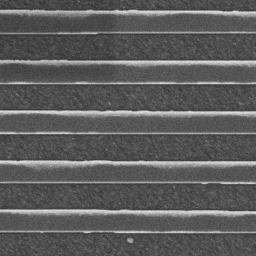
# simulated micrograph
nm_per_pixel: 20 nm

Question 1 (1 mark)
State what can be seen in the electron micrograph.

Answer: lines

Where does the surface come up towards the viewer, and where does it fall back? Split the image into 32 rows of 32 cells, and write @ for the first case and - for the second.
--------------------------------
@@@@@-----@@@@@@@---@@@@-@@-----
@@@@@@@@@@@@@@@@@@@@@@@@@@@@@@@@
@@@@@@@@@@@@@@@@@@@@@@@@@@@@@@@@
--------------------------------
--------------------------------
--------------------------------
--------------------------------
@@@@@@@@@@@@@@@@@@@@@@@@@@@@@@@@
@@@@@@@@@@@@@@@@@@@@@@@@@@@@@@@@
--------------------------------
--------------------------------
--------------------------------
--------------------------------
@@@@@@@@@@@@@@@@@@@@@@@@@@@@@@@@
@@@@@@@@@@@@@@@@@@@@@@@@@@@@@@@@
@@@@@@@@@@@@@@@@@@@@@@@@@@@@@@@@
--------------------------------
--------------------------------
--------------------------------
@@@@@@@@@@@@@@@@@@@@@@@@@@@@@@@@
@@@@@@@@@@@@@@@@@@@@@@@@@@@@@@@@
@@@@@@@@@@@@@@@@@@@@@@@@@@@@@@@@
--------------------------------
--------------------------------
--------------------------------
@@@@@@@@@@@@@@@@@@@@@@@@@@@@-@@@
@@@@@@@@@@@@@@@@@@@@@@@@@@@@@@@@
@@@@@@@@@@@@@@@@@@@@@@@@@@@@@@@@
--------------------------------
--------------------------------
--------------------------------